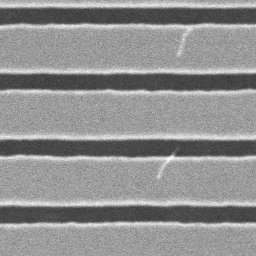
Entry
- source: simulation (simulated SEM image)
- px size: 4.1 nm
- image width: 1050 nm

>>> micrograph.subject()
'lines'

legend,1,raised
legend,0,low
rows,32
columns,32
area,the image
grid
11111111111111111111111111111111
00000000000000000000000000000000
00000000000000000000000000000000
11111111111111111111111111111111
11111111111111111111111111111111
11111111111111111111111111111111
11111111111111111111111111111111
11111111111111111111111111111111
11111111111111111111111111111111
00000000000000000000000000000000
00000000000000000000000000000000
11111111111111111111111111111111
11111111111111111111111111111111
11111111111111111111111111111111
11111111111111111111111111111111
11111111111111111111111111111111
11111111111111111111111111111111
00000000000000000000000000000000
00000000000000000000000000000000
00110000000000000000000000000000
11111111111111111111111111111111
11111111111111111111111111111111
11111111111111111111111111111111
11111111111111111111111111111111
11111111111111111111111111111111
11111111111111111111111111111111
00000000000000000000000000000000
00000000000000000000000000000000
11111111111111111111111111111111
11111111111111111111111111111111
11111111111111111111111111111111
11111111111111111111111111111111